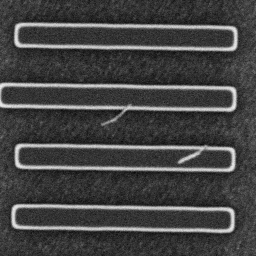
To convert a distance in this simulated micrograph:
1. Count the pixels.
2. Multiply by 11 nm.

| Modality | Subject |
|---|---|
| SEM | groups of lines, slits or small figures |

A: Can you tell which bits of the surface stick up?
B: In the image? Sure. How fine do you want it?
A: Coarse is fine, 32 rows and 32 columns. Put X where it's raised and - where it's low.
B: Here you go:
--------------------------------
--------------------------------
--------------------------------
--XXXXXXXXXXXXXXXXXXXXXXXXXXX---
--XXXXXXXXXXXXXXXXXXXXXXXXXXX---
--XXXXXXXXXXXXXXXXXXXXXXXXXXX---
--------------------------------
--------------------------------
--------------------------------
--------------------------------
--------------------------------
XXXXXXXXXXXXXXXXXXXXXXXXXXXXX---
XXXXXXXXXXXXXXXXXXXXXXXXXXXXX---
---------------XXXXXXXXXXXXXX---
--------------------------------
--------------------------------
--------------------------------
--------------------------------
--XXXXXXXXXXXXXXXXXXXXXXXX------
--XXXXXXXXXXXXXXXXXXXXXXXXXXX---
--XXXXXXXXXXXXXXXXXXXXXXXXXXX---
--------------------------------
--------------------------------
--------------------------------
--------------------------------
--------------------------------
--XXXXXXXXXXXXXXXXXXXXXXXXXXX---
--XXXXXXXXXXXXXXXXXXXXXXXXXXX---
----XXXXXXXXXXXXXXXXXXXXXXXXX---
--------------------------------
--------------------------------
--------------------------------